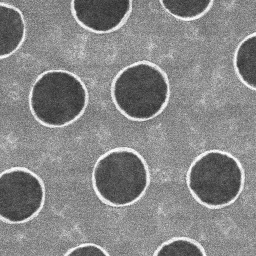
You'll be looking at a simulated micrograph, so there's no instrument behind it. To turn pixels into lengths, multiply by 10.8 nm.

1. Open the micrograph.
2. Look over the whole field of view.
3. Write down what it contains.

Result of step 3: raised bodies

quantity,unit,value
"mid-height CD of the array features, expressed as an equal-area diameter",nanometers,604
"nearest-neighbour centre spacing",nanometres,923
